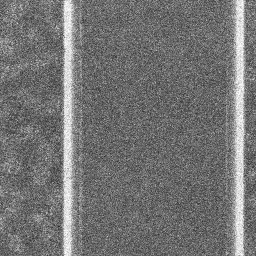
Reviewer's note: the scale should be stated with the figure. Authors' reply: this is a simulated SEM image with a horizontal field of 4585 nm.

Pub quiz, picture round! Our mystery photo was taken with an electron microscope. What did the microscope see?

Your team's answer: one or a few lines or trenches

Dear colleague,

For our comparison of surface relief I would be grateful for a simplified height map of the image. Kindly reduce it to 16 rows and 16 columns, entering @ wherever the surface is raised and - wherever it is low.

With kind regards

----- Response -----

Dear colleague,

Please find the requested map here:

----@@@@@@@@@@@-
----@@@@@@@@@@@-
----@@@@@@@@@@@-
----@@@@@@@@@@@-
----@@@@@@@@@@@-
----@@@@@@@@@@@-
----@@@@@@@@@@@-
----@@@@@@@@@@@-
----@@@@@@@@@@@-
----@@@@@@@@@@@-
----@@@@@@@@@@@-
----@@@@@@@@@@@-
----@@@@@@@@@@@-
----@@@@@@@@@@@-
----@@@@@@@@@@@-
----@@@@@@@@@@@-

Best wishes